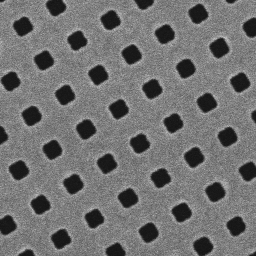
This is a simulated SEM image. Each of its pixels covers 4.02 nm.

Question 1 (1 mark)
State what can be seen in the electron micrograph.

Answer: a regular array of holes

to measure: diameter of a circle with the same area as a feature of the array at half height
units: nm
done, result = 77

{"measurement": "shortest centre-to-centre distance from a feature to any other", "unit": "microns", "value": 0.157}